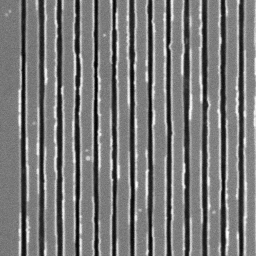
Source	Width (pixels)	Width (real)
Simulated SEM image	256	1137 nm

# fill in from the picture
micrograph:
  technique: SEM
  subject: parallel lines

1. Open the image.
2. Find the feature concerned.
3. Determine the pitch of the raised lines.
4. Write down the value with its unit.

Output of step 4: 0.0806 um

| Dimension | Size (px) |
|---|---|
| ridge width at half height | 13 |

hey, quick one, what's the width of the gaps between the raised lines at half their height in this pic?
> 22.7 nm